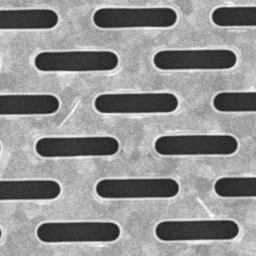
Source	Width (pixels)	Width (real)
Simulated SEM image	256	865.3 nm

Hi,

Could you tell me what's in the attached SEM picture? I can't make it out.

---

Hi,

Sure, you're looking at groups of lines, slits or small figures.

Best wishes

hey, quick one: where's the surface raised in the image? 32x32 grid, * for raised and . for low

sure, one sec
********************************
.......*****..........*****.....
.......*****..........****......
.......*****.........***********
********************************
********************************
*****.........******.........***
****...........****...........**
*****.........******.........***
********************************
********************************
*******************..*******....
.......*****..........*****.....
.......*****..........*****.....
..******************************
********************************
********************************
*****..........*****..........**
****...........****...........**
*****.........******************
********************************
********************************
.......******.........*****.....
........****..........*****.....
.......*****..........*****.....
********************************
********************************
************************.....***
*****..........****...........**
*****..........*****..........**
********************************
********************************